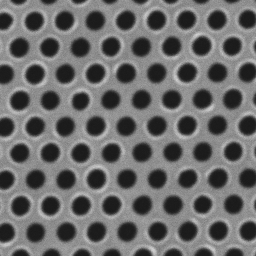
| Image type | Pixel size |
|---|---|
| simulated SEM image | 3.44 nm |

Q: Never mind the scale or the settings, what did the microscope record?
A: a regular array of holes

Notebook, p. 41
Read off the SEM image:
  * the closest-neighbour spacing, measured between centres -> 104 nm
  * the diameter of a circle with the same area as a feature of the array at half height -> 0.0664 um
